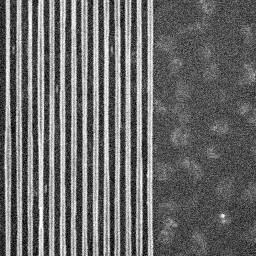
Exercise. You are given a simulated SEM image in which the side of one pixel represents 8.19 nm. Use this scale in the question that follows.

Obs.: parallel lines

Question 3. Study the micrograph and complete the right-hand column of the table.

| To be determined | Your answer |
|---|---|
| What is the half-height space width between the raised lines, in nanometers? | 54.3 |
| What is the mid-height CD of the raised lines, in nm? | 31.7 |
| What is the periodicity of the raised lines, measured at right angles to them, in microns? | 0.0894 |